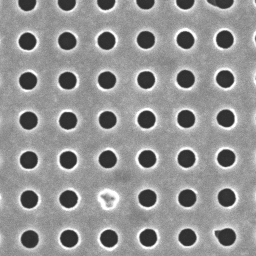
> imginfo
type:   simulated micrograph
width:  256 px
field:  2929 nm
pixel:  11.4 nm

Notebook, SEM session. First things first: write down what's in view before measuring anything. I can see a regular array of holes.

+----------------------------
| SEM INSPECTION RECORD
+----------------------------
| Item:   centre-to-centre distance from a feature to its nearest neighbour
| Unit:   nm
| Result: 449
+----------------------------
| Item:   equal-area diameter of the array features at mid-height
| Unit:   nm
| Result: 214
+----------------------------